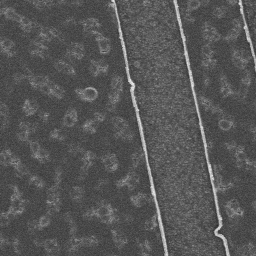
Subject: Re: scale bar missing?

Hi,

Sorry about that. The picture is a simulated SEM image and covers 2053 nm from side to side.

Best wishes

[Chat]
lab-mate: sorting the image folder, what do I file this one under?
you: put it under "one or a few lines or trenches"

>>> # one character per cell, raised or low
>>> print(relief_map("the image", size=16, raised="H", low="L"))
HHHHHHHLLLLHHHHL
HHHHHHHLLLLHHHHL
HHHHHHHHLLLHHHHH
HHHHHHHHLLLLHHHH
HHHHHHHHLLLLHHHH
HHHHHHHHLLLLHHHH
HHHHHHHHHLLLHHHH
HHHHHHHHHLLLHHHH
HHHHHHHHHLLLLHHH
HHHHHHHHHLLLLHHH
HHHHHHHHHLLLLHHH
HHHHHHHHHHLLLHHH
HHHHHHHHHHLLLHHH
HHHHHHHHHHLLLLHH
HHHHHHHHHHLLLLHH
HHHHHHHHHHLLLLHH